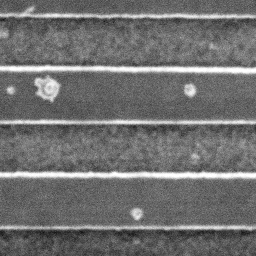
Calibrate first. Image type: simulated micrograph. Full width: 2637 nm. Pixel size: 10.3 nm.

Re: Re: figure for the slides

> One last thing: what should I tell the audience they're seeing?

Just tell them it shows lines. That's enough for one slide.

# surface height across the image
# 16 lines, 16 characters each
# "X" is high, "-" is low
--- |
XXXXXXXXXXXXXXXX
----------------
----------------
----------------
XXXXXXXXXXXXXXXX
XXXXXXXXXXXXXXXX
XXXXXXXXXXXXXXXX
XXXXXXXXXXXXXXXX
----------------
----------------
----------------
XXXXXXXXXXXXXXXX
XXXXXXXXXXXXXXXX
XXXXXXXXXXXXXXXX
----------------
----------------